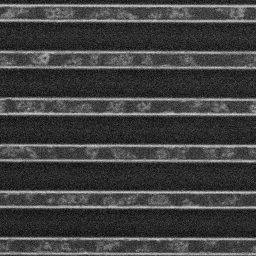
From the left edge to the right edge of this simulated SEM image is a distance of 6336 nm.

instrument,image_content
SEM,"parallel lines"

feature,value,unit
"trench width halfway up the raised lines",31.1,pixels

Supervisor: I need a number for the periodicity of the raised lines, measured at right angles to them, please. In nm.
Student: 1150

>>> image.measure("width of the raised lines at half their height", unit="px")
15